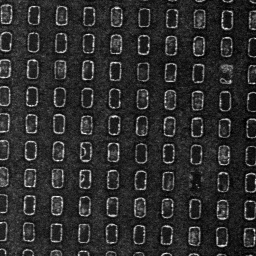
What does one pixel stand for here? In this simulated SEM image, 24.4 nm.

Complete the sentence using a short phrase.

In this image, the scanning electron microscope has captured a regular array of raised bodies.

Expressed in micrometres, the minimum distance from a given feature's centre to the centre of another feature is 0.655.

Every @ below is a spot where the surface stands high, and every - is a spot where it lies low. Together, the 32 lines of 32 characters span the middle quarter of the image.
-----@@-----@@-----@@-----@@----
-----@@-----@@-----@@-----@@----
-----@@-----@@-----@@----@@@----
-----@@-----@@-----@@----@@@----
--------------------------------
--------------------------------
-----@@-----@@------------------
-----@@-----@@----@@@----@@@----
-----@@-----@@----@@@----@@@----
-----@@-----@@----@@@----@@@----
-----@@-----@@----@@@----@@@----
--------------------------------
--------------------------------
-----@@-----@@-----@@-----------
----@@@----@@@----@@@----@@@----
----@@@----@@@----@@@----@@@----
----@@@----@@@----@@@----@@@----
------------@-----@@-----@@-----
--------------------------------
--------------------------------
----@@@----@@@----@@-----@@-----
-----@@----@@@----@@@----@@-----
-----@@----@@@----@@-----@@-----
----@@@----@@@----@@-----@@-----
-------------------@-----@@-----
--------------------------------
--------------------------------
----@@@----@@-----@@-----@@-----
-----@@----@@-----@@-----@@-----
----@@@----@@-----@@-----@@-----
----@@-----@@-----@@-----@@-----
--------------------------------